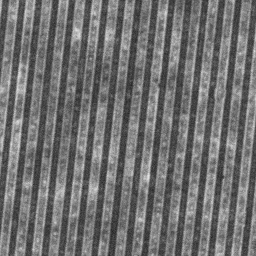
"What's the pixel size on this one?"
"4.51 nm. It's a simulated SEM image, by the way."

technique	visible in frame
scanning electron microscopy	parallel lines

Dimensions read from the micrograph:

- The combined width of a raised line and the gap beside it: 74.6 nm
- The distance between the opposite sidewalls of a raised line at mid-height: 38.1 nanometres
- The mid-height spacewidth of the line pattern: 38.1 nm